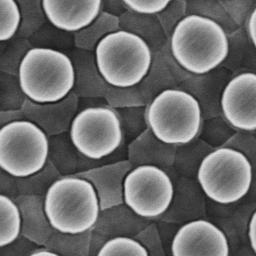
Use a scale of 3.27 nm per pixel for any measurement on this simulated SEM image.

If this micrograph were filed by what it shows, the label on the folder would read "a regular array of raised bodies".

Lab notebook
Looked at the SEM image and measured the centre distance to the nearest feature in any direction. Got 252 nanometers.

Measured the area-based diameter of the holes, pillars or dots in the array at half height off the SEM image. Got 173 nanometres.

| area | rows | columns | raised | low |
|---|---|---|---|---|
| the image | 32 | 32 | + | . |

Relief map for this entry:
++....++++++....+++++...........
++....++++++......+.............
++....+++++............+++.....+
++......++............+++++....+
+.............+++.....++++++...+
............++++++....++++++....
....+++.....+++++++...++++++....
...++++++...+++++++...++++++....
...++++++...++++++.....+++......
...++++++....+++++............++
...++++++.....+++............+++
...+++++.............++.....++++
....+++............+++++....++++
...................++++++...++++
..........++++.....++++++...++++
.+++.....++++++....++++++....+++
+++++....++++++....++++++.......
++++++...++++++.....++++........
++++++....++++..................
++++++.....++.............++++..
+++++....................++++++.
.+++.............+++.....++++++.
........++......+++++....++++++.
......+++++.....+++++....++++++.
......++++++....+++++.....++++..
++....++++++....+++++...........
++....++++++.....+++............
++....++++++....................
++.....++++............++++....+
++....................++++++...+
+............++++.....++++++....
.............+++++....++++++....